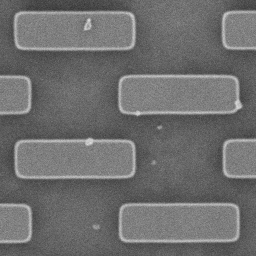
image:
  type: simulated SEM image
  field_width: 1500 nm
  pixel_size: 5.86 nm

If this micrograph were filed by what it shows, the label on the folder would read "groups of lines, slits or small figures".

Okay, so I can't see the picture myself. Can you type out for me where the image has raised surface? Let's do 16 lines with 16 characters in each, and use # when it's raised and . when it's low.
................
.#######......##
.#######......##
................
................
##.....########.
##.....########.
................
................
.#######......##
.#######......##
................
................
##.....########.
##.....########.
................